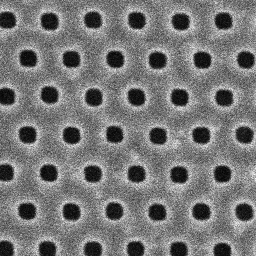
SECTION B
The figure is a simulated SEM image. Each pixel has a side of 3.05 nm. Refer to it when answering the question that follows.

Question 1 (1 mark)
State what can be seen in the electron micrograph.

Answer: a regular array of holes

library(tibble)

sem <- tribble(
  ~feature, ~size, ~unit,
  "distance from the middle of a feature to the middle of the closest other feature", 131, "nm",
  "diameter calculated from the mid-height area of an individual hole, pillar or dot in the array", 56.8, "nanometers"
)